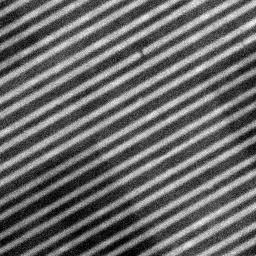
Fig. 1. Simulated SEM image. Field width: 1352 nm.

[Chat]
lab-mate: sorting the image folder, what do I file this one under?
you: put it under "parallel lines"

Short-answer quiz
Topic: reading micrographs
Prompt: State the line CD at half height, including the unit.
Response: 25.8 nm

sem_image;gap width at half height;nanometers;48.6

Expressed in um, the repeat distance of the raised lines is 0.0775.